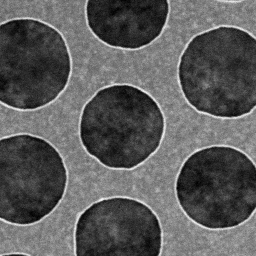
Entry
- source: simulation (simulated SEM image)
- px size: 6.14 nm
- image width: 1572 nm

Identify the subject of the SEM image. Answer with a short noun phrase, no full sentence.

holes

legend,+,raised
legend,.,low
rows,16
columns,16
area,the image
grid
+++++......+++++
...+++....++++++
....++....++....
....+++++++.....
....+++++++.....
....+++.+++.....
...++.....++....
+++++.....++++++
+.+++.....++++++
....++....++...+
....+++.+++.....
....+++++++.....
....++..+++.....
...++.....++....
+++++.....++++++
+++++.....++++++